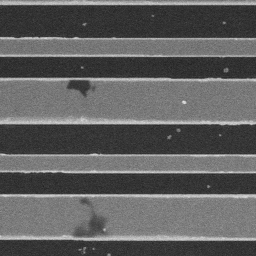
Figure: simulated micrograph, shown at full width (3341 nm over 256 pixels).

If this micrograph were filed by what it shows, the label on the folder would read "lines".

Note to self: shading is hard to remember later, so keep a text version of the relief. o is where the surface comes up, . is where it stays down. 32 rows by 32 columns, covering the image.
............oooooooooooooooooooo
................................
................................
................................
................................
oooooooooooooooooooooooooooooooo
oooooooooooooooooooooooooooooooo
................................
................................
................................
oooooooooooooooooooooooooooooooo
oooooooooooooooooooooooooooooooo
oooooooooooooooooooooooooooooooo
oooooooooooooooooooooooooooooooo
oooooooooooooooooooooooooooooooo
................................
................................
................................
................................
oooooooooooooooooooooooooooooooo
oooooooooooooooooooooooooooooooo
.........o...ooooooooooooooooooo
................................
................................
oooooooooooooooooooooooooooooooo
oooooooooooooooooooooooooooooooo
oooooooooooooooooooooooooooooooo
oooooooooooooooooooooooooooooooo
oooooooooooooooooooooooooooooooo
oooooooooooooooooooooooooooooooo
................................
................................